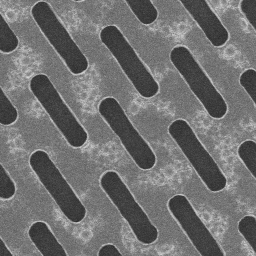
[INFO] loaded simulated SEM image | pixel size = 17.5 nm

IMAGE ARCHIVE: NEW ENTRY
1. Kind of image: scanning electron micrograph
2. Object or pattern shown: a regular array of holes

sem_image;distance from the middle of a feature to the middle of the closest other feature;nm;1280